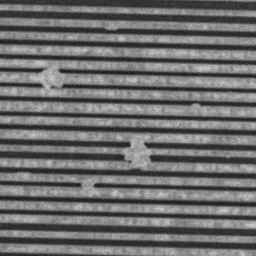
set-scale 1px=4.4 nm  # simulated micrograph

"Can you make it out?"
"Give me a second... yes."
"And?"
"parallel lines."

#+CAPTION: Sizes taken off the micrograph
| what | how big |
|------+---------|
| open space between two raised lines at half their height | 27.5 nanometers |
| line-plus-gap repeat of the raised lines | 62.3 nm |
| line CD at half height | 35.2 nanometers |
